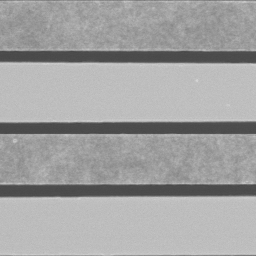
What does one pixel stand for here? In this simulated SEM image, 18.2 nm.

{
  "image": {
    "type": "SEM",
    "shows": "lines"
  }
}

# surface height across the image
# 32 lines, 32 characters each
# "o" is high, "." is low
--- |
oooooooooooooooooooooooooooooooo
oooooooooooooooooooooooooooooooo
oooooooooooooooooooooooooooooooo
oooooooooooooooooooooooooooooooo
oooooooooooooooooooooooooooooooo
oooooooooooooooooooooooooooooooo
................................
................................
oooooooooooooooooooooooooooooooo
oooooooooooooooooooooooooooooooo
oooooooooooooooooooooooooooooooo
oooooooooooooooooooooooooooooooo
oooooooooooooooooooooooooooooooo
oooooooooooooooooooooooooooooooo
oooooooooooooooooooooooooooooooo
................................
................................
oooooooooooooooooooooooooooooooo
oooooooooooooooooooooooooooooooo
oooooooooooooooooooooooooooooooo
oooooooooooooooooooooooooooooooo
oooooooooooooooooooooooooooooooo
oooooooooooooooooooooooooooooooo
................................
................................
oooooooooooooooooooooooooooooooo
oooooooooooooooooooooooooooooooo
oooooooooooooooooooooooooooooooo
oooooooooooooooooooooooooooooooo
oooooooooooooooooooooooooooooooo
oooooooooooooooooooooooooooooooo
oooooooooooooooooooooooooooooooo